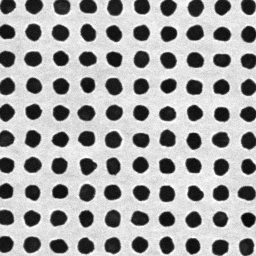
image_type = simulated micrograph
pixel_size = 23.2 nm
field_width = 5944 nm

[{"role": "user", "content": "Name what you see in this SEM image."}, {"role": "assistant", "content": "a regular array of holes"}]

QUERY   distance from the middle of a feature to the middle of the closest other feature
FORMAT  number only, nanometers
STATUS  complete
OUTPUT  601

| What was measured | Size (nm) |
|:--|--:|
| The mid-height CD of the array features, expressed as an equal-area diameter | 396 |